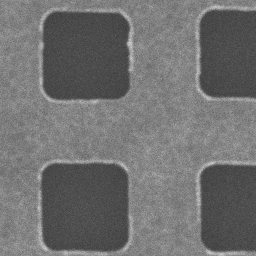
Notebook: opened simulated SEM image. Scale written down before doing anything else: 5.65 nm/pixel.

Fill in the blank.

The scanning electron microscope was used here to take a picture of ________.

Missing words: holes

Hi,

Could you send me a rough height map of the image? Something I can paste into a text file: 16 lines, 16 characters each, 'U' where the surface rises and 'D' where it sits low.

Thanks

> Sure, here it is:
UUUUUUUUUUUUUUUU
UUUDDDDDUUUUUDDD
UUUDDDDDUUUUDDDD
UUUDDDDDUUUUDDDD
UUUDDDDDUUUUDDDD
UUUDDDDDUUUUUDDD
UUUUUUUUUUUUUUUU
UUUUUUUUUUUUUUUU
UUUUUUUUUUUUUUUU
UUUUUUUUUUUUUUUU
UUUDDDDDUUUUUDDD
UUUDDDDDUUUUUDDD
UUUDDDDDUUUUUDDD
UUUDDDDDUUUUUDDD
UUUDDDDDUUUUUDDD
UUUDDDDDUUUUUDDD